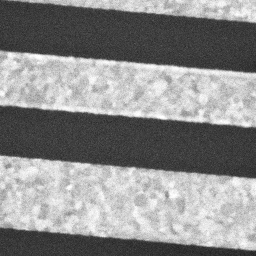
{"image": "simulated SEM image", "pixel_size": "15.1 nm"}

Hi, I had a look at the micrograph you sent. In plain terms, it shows lines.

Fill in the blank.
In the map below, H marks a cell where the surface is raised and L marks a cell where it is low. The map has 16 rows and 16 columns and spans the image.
LLLLLLHHHHHHHHHH
LLLLLLLLLLLLLLLL
LLLLLLLLLLLLLLLL
HHHLLLLLLLLLLLLL
HHHHHHHHHHHHHHHL
HHHHHHHHHHHHHHHH
HHHHHHHHHHHHHHHH
LLLLLLLLLLLHHHHH
LLLLLLLLLLLLLLLL
LLLLLLLLLLLLLLLL
HHHHHHHHLLLLLLLL
HHHHHHHHHHHHHHHH
HHHHHHHHHHHHHHHH
HHHHHHHHHHHHHHHH
LLLHHHHHHHHHHHHH
LLLLLLLLLLLLLLLH